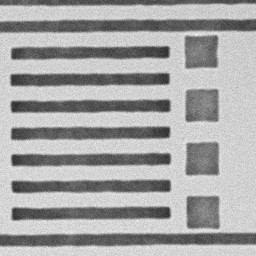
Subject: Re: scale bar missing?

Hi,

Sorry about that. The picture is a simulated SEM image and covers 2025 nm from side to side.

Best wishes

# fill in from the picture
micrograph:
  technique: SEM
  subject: groups of lines, slits or small figures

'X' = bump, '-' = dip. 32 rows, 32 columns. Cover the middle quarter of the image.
XXXXXXXXXXXXXXXXXXXXXXXXXXXXXX--
XXXXXXXXXXXXXXXXXXXXXXXXXXXXXXXX
--------------------------XXXXXX
---------------------------XXXXX
---------------------------XXXXX
-----------XXXXXXX--XXXXXXXXXXXX
XXXXXXXXXXXXXXXXXXXXXXXXXXXXXXX-
XXXXXXXXXXXXXXXXXXXXXXXXXXXXXX--
XXXXXXXXXXXXXXXXXXXXXXXXXXXXXX--
---------------------------XXX--
---------------------------XXX--
---------------------------XXX--
XXXXXXXXXXXXXXXXXXXXXXXXXXXXXX--
XXXXXXXXXXXXXXXXXXXXXXXXXXXXXX--
XXXXXXXXXXXXXXXXXXXXXXXXXXXXXX--
XXX--XXXXXXXXXXX----------XXXXXX
---------------------------XXXXX
---------------------------XXXXX
--------------------------XXXXXX
XXXXXXXXXXXXXXXXXXXXXXXXXXXXXXXX
XXXXXXXXXXXXXXXXXXXXXXXXXXXXXX--
XXXXXXXXXXXXXXXXXXXXXXXXXXXXXX--
---------------------------XXX--
---------------------------XXX--
---------------------------XXX--
------------------XXX--XXXXXXX--
XXXXXXXXXXXXXXXXXXXXXXXXXXXXXX--
XXXXXXXXXXXXXXXXXXXXXXXXXXXXXX--
XXXXXXXXXXXXXXXXXXXXXXXXXXXXXXXX
---------------------------XXXXX
---------------------------XXXXX
---------------------------XXXXX